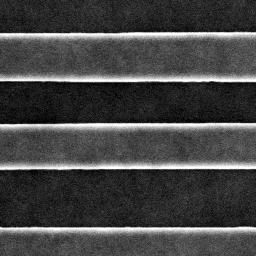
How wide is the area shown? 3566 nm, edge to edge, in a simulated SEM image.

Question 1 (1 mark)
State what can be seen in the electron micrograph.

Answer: lines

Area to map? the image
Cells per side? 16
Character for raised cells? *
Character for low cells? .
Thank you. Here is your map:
................
................
****************
****************
****************
................
................
................
****************
****************
************....
................
................
................
****************
****************